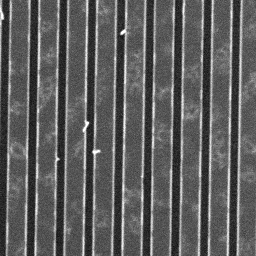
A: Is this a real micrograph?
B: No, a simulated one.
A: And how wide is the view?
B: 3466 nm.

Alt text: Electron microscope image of parallel lines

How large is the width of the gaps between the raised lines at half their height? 124 nm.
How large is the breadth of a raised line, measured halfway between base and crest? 271 nm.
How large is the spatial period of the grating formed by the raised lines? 390 nanometers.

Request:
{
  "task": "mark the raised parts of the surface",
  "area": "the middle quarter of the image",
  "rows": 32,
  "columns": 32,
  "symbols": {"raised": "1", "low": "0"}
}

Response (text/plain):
01111100111110011111000111100011
01111100111110011111000111100011
01111100111110011111000111100011
01111100111110011111000111100011
01111100111110011111000111100011
01111000111110011111000111100011
01111000111110011111000111100011
01111000111110011111001111100011
01111000111110011111001111100011
01111000111110011111001111100011
01111000111110011111001111100111
01111000111110011111001111100111
01111000111110011111001111100111
01111000111110011111001111100111
01111100111110011111001111100111
01111100111110011111001111100111
01111000111110011111001111100111
01111000111110011111001111100111
01111000111110011111001111100111
01111000111110011111001111100111
01111000111110011111001111100111
11111000111110011111001111100111
11111001111100011111001111100111
11111000111100011111001111100011
11111000111100011111001111100111
11111000111100011111001111100111
11111000111100011111001111100111
11111000111100011111001111100111
11111000111100011111001111100111
11111000111100011111001111100111
11111000111100011111001111100111
11111000111100011111001111100111